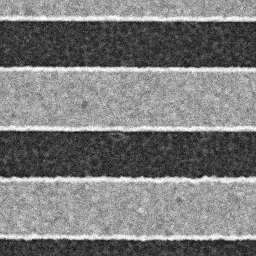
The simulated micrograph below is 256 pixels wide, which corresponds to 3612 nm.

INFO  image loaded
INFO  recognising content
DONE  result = one or a few lines or trenches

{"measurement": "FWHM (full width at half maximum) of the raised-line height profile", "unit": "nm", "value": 822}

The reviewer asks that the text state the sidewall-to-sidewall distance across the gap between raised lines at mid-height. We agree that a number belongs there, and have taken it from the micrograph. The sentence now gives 723 nm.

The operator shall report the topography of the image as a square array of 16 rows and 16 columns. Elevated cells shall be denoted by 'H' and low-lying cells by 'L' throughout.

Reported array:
HHHHHHHHHHHHHHHH
LLLLLLLLLLLLLLLL
LLLLLLLLLLLLLLLL
LLLLLLLLLLLLLLLL
HHHHHHHHHHHHHHHH
HHHHHHHHHHHHHHHH
HHHHHHHHHHHHHHHH
HHHHHHHHHHHHHHHH
LLLLLLLLLLLLLLLL
LLLLLLLLLLLLLLLL
LLLLLLLLLLLLLLLL
HHHHHHHHHHHHHHHH
HHHHHHHHHHHHHHHH
HHHHHHHHHHHHHHHH
HHHHHHHHHHHHHHHH
LLLLLLLLLLLLLLLL